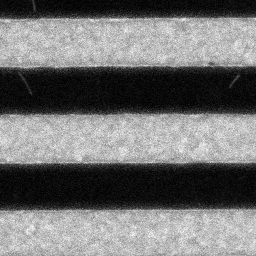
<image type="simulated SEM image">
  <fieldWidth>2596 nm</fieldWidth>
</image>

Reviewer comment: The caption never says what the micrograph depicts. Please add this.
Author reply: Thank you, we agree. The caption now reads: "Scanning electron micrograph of one or a few lines or trenches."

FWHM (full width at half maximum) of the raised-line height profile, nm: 498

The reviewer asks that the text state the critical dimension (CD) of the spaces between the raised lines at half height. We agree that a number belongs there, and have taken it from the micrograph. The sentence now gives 46.2 pixels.